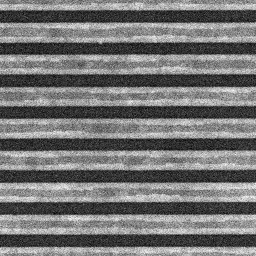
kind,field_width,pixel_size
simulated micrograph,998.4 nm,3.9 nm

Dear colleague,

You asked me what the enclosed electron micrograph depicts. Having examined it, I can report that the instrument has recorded parallel lines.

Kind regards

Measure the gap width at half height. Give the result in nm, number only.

61.9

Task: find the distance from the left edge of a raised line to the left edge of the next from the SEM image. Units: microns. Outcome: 0.125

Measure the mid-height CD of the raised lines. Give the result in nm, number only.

61.9